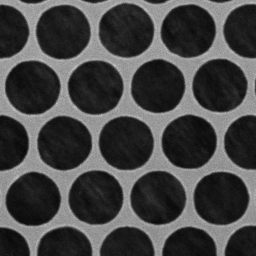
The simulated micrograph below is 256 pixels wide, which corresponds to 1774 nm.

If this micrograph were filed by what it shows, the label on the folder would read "a regular array of holes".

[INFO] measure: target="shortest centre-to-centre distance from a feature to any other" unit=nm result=432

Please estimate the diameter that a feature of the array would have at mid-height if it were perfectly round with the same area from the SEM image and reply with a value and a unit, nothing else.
0.383 µm